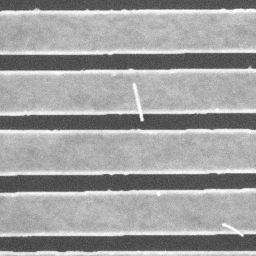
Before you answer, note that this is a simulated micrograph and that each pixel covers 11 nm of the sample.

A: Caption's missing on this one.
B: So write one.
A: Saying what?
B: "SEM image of lines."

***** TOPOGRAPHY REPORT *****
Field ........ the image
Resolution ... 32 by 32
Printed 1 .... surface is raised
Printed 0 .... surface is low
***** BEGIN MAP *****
00000000000000000000000000000000
00010001111111111111111111111111
11111111111111111111111111111111
11111111111111111111111111111111
11111111111111111111111111111111
11111111111111111111111111111111
11111111111111111111111111111110
00000000000000000000000000000000
00000000000000000000000000000000
11111111111111111111111111111111
11111111111111111111111111111111
11111111111111111111111111111111
11111111111111111111111111111111
11111111111111111111111111111111
00000000000000000000000000000000
00000000000000000000000000000000
11111111111111111111111111111111
11111111111111111111111111111111
11111111111111111111111111111111
11111111111111111111111111111111
11111111111111111111111111111111
11111111111111111111111111111111
00000000000000000000000000000000
00000000000000000000000000000000
11111111111111111111111111111111
11111111111111111111111111111111
11111111111111111111111111111111
11111111111111111111111111111111
11111111111111111111111111111111
00000000000000000000000000000000
00000000000000000000000000000000
00000000000001110111011111111111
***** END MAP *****